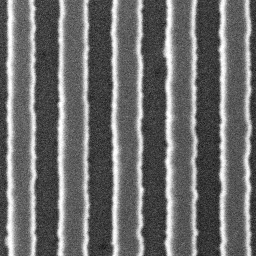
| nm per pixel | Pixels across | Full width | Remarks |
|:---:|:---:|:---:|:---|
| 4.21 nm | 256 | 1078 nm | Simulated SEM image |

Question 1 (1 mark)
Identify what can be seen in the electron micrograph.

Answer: lines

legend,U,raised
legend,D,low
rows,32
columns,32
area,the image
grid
DUUUDDDDUUUDDDUUUUDDDUUUDDDDUUUD
DUUUDDDDUUUDDDUUUUDDDUUUDDDDUUUD
DUUUDDDDUUUDDDUUUUDDDUUUDDDDUUUD
DUUUDDDUUUUDDDUUUUDDDUUUDDDDUUUD
DUUUDDDDUUUDDDUUUUDDDUUUDDDDUUUD
DUUUDDDDUUUDDDUUUDDDDUUUDDDDUUUD
DUUUDDDDUUUDDDUUUUDDDUUUDDDDUUUD
DUUUDDDDUUUDDDUUUUDDDUUUDDDDUUUD
DUUUDDDDUUUDDDUUUUDDDUUUDDDDUUUD
DUUUDDDUUUUDDDUUUUDDDUUUDDDDUUUD
DUUUDDDDUUUDDDUUUUDDDUUUDDDDUUUD
DUUUDDDDUUUDDDUUUUDDDUUUDDDDUUUD
DUUUDDDDUUUDDDUUUUDDDUUUDDDDUUUD
DUUUDDDUUUUDDDUUUUDDDUUUDDDDUUUD
DUUUDDDDUUUDDDUUUUDDDUUUDDDDUUUD
DUUUDDDUUUUDDDUUUDDDDUUUDDDDUUUD
DUUUDDDUUUUDDDUUUUDDDUUUDDDDUUUD
DUUUDDDUUUUDDDUUUUDDDUUUUDDDUUUD
DUUUDDDUUUUDDDUUUUDDDUUUDDDDUUUD
DUUUDDDUUUUDDDUUUUDDDUUUDDDDUUUD
DUUUDDDUUUUDDDUUUUDDDUUUDDDDUUUD
DUUUDDDUUUUDDDUUUUDDDUUUDDDDUUUD
DUUUDDDDUUUDDDUUUUDDDUUUDDDDUUUD
DUUUDDDDUUUDDDUUUUDDDUUUDDDDUUUD
DUUUDDDDUUUDDDUUUUDDDUUUUDDDUUUD
DUUUDDDUUUUDDDUUUUDDDUUUDDDDUUUD
DUUUDDDDUUUDDDUUUUDDDUUUDDDDUUUD
DUUUDDDDUUUDDDUUUUDDDUUUDDDDUUUD
DUUUDDDUUUUDDDUUUUDDDUUUDDDDUUUD
DUUUDDDUUUUDDDUUUUDDDUUUDDDDUUUD
DUUUDDDUUUUDDDUUUUDDDUUUDDDDUUUD
DUUUDDDUUUUDDDUUUUDDDUUUDDDDUUUD